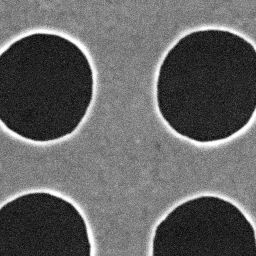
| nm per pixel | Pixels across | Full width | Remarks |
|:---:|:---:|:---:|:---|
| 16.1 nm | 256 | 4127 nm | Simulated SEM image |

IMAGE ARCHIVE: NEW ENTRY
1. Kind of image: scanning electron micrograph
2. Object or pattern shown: holes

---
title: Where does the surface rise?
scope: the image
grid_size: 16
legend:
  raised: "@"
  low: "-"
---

@@@@@@@@@@@@@@@@
@@@@@@@@@@@@@@@@
@---@@@@@@@----@
-----@@@@@------
------@@@@------
------@@@@------
------@@@@------
-----@@@@@------
@---@@@@@@@----@
@@@@@@@@@@@@@@@@
@@@@@@@@@@@@@@@@
@@@@@@@@@@@@@@@@
@---@@@@@@@@--@@
-----@@@@@-----@
------@@@@------
------@@@@------